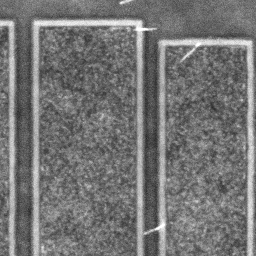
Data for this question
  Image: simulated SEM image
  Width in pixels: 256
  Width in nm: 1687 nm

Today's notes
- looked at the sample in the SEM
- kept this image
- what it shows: one or a few lines or trenches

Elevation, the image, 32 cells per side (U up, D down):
DDDDDDDDDDDDDDDDDDDDDDDDDDDDDDDD
DDDDDDDDDDDDDDDDDDDDDDDDDDDDDDDD
DDDDDDDDDDDDDDDDDDDDDDDDDDDDDDDD
UDDDDUUUUUUUUUUUUUDDDDDDDDDDDDDD
UDDDDUUUUUUUUUUUUDDDDDDDDDDDDDDD
UDDDDUUUUUUUUUUUUDDDDUUUUUUUUUUD
UDDDDUUUUUUUUUUUUDDDUUUUUUUUUUUD
UDDDDUUUUUUUUUUUUDDDUUUUUUUUUUUD
UDDDDUUUUUUUUUUUUDDDUUUUUUUUUUUD
UDDDDUUUUUUUUUUUUDDDUUUUUUUUUUUD
UDDDDUUUUUUUUUUUUDDDUUUUUUUUUUUD
UDDDDUUUUUUUUUUUUDDDUUUUUUUUUUUD
UDDDDUUUUUUUUUUUUDDDUUUUUUUUUUUD
UDDDDUUUUUUUUUUUUDDDUUUUUUUUUUUD
UDDDDUUUUUUUUUUUUDDDUUUUUUUUUUUD
UDDDDUUUUUUUUUUUUDDDUUUUUUUUUUUD
UDDDDUUUUUUUUUUUUDDDUUUUUUUUUUUD
UDDDDUUUUUUUUUUUUDDDUUUUUUUUUUUD
UDDDDUUUUUUUUUUUUDDDDUUUUUUUUUUD
UDDDDUUUUUUUUUUUUDDDUUUUUUUUUUUD
UDDDDUUUUUUUUUUUUDDDUUUUUUUUUUUD
UDDDDUUUUUUUUUUUUDDDUUUUUUUUUUUD
UDDDDUUUUUUUUUUUUDDDUUUUUUUUUUUD
UDDDDUUUUUUUUUUUUDDDUUUUUUUUUUUD
UDDDDUUUUUUUUUUUUDDDUUUUUUUUUUUD
UDDDDUUUUUUUUUUUUDDDUUUUUUUUUUUD
UDDDDUUUUUUUUUUUUDDDUUUUUUUUUUUD
UDDDDUUUUUUUUUUUUDDDUUUUUUUUUUUD
UDDDDUUUUUUUUUUUUDDDUUUUUUUUUUUD
UDDDDUUUUUUUUUUUUDDDUUUUUUUUUUUD
UDDDDUUUUUUUUUUUUDDDDUUUUUUUUUUD
UDDDDUUUUUUUUUUUUDDDDUUUUUUUUUUD